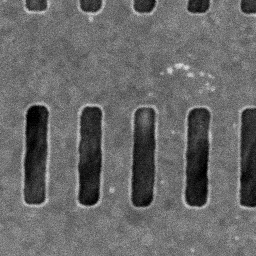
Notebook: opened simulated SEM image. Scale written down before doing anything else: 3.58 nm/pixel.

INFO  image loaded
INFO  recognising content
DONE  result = holes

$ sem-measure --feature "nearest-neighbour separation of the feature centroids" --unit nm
192